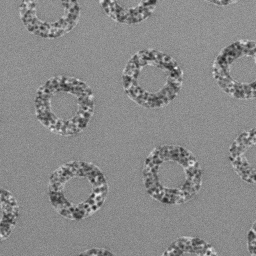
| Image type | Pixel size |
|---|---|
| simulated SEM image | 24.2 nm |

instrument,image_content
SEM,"ring-shaped raised bodies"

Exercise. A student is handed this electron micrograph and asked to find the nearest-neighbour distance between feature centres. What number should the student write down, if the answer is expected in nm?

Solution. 2140